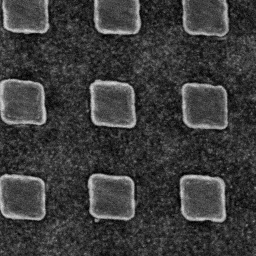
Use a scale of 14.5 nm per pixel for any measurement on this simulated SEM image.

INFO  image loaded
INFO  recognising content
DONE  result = raised bodies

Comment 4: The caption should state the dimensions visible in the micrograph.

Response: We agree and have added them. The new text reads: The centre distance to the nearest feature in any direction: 1330 nm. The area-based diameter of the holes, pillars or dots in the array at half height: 0.706 µm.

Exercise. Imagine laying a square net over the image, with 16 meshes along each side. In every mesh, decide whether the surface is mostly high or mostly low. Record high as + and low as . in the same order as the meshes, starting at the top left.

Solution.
+++...+++..+++..
+++...+++..+++..
................
................
................
+++...++....++..
+++...++...+++..
+++...++....++..
................
................
................
+++...++...+++..
+++...++...+++..
.++...++....++..
................
................